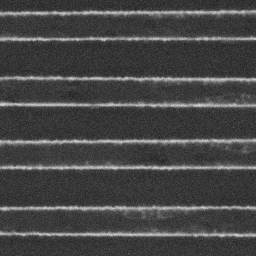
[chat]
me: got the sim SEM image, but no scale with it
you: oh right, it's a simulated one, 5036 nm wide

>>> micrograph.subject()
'lines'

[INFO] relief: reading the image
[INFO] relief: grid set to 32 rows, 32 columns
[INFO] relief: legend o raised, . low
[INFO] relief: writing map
................................
...........................o.oo.
oooooooooooooooooooooooooooooooo
oooooooooooooooooooooooooooooooo
oooooooooooooooooooooooooooooooo
................................
................................
................................
................................
................................
oooooooooooooooooooooooooooooooo
oooooooooooooooooooooooooooooooo
oooooooooooooooooooooooooooooooo
................................
................................
................................
................................
................................
oooooooooooooooooooooooooooooooo
oooooooooooooooooooooooooooooooo
oooooooooooooooooooooooooooooooo
................................
................................
................................
................................
................................
oooooooooooooooooooooooooooooooo
oooooooooooooooooooooooooooooooo
oooooooooooooooooooooooooooooooo
................................
................................
................................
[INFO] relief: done